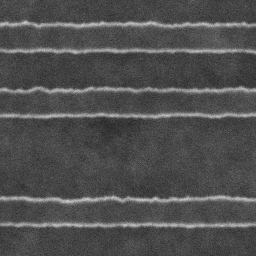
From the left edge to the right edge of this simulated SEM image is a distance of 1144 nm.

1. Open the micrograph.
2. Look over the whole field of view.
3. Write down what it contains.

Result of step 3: lines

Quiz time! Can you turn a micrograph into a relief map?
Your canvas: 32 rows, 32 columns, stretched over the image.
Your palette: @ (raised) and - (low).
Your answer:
--------------------------------
--------------------------------
--------------------------------
@@@@@@@@@@@@@@@@@@@@@@@@@@@@@@@@
@@@@@@@@@@@@@@@@@@@@@@@@@@@@@@@@
@@@@@@@@@@@@@@@@@@@@@@@@@@@@@@@@
-@@@---@@@@---@@--@@@@-@@@@@@--@
--------------------------------
--------------------------------
--------------------------------
--------------------------------
@@@@@@@@@@@@@@@@@@@@@@@@@@@@@@@@
@@@@@@@@@@@@@@@@@@@@@@@@@@@@@@@@
@@@@@@@@@@@@@@@@@@@@@@@@@@@@@@@@
@@@@@@@@@@@@--@@@@@@@@---@@@-@@-
--------------------------------
--------------------------------
--------------------------------
--------------------------------
--------------------------------
--------------------------------
--------------------------------
--------------------------------
--------------------------------
--------------------------------
@@@@@@@@@@@@@@@@@@@@@@@@@@@@@@@@
@@@@@@@@@@@@@@@@@@@@@@@@@@@@@@@@
@@@@@@@@@@@@@@@@@@@@@@@@@@@@@@@@
--------------------------------
--------------------------------
--------------------------------
--------------------------------